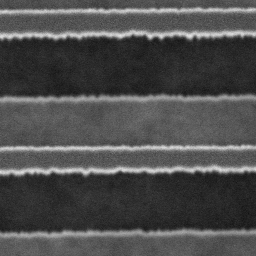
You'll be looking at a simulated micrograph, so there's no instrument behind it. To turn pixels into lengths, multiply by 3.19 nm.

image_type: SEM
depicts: lines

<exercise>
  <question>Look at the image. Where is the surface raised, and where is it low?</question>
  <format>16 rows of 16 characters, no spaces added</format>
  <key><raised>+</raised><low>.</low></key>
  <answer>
++++++++++++++++
++++++++++++++++
................
................
................
................
++++++++++++++++
++++++++++++++++
++++++++++++++++
++++++++++++++++
++++++++++++++++
................
................
................
........+..+++++
++++++++++++++++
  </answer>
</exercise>